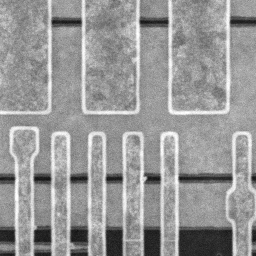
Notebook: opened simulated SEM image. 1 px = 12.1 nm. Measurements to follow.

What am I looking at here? wiring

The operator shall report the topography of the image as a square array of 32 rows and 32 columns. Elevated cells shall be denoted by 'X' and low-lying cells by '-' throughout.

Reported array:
XXXXXX----XXXXXXX----XXXXXXXX---
XXXXXX----XXXXXXX----XXXXXXXX---
XXXXXX----XXXXXXX----XXXXXXXX---
XXXXXX----XXXXXXX----XXXXXXXX---
XXXXXX----XXXXXXX----XXXXXXXX---
XXXXXX----XXXXXXX----XXXXXXXX---
XXXXXX----XXXXXXX----XXXXXXXX---
XXXXXX----XXXXXXX----XXXXXXXX---
XXXXXX----XXXXXXX----XXXXXXXX---
XXXXXX----XXXXXXX----XXXXXXXX---
XXXXXX----XXXXXXX----XXXXXXXX---
XXXXXX----XXXXXXX----XXXXXXXX---
XXXXXX----XXXXXXX----XXXXXXXX---
XXXXXX----XXXXXXX----XXXXXXX----
--------------------------------
--------------------------------
-XXXX---------------------------
-XXXX--XX--XX---XX--XX-------XX-
-XXXX--XX--XX---XX--XX-------XX-
--XX---XX--XX---XX--XX-------XX-
--XX---XX--XX---XX--XX-------XX-
--XX---XX--XX---XX--XX-------XX-
--XX---XX--XX---XX--XX-------XX-
--XX---XX--XX---XX--XX-------XX-
--XX---XX--XX---XX--XX------XXXX
--XX---XX--XX---XX--XX------XXXX
--XX---XX--XX---XX--XX------XXXX
--XX---XX--XX---XX--XX-------XXX
--XX---XX--XX---XX--XX-------XX-
--XX---XX--XX---XX--XX-------XX-
--XX---XX--XX---XX--XX-------XX-
--XX---XX--XX---XX--XX-------XX-